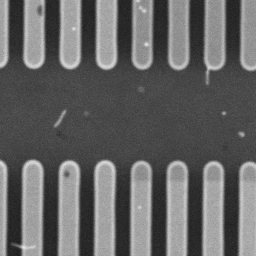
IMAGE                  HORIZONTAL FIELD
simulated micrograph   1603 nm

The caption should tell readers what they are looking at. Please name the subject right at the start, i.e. groups of lines, slits or small figures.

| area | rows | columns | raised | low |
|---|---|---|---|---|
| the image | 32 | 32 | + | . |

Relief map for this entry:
+..++...++..+++..++..+++..++..++
+..++...++..+++..++..+++..++..++
+..++...++..++...++..+++..++..++
+..++...++..++...++..+++..++..++
+..++...++..++...++..+++..++..++
+..++...++..++...++..+++..++..++
+..++...++..++...++..+++..++..++
+..++...++..++...++..+++..++..++
......................+...+....+
................................
................................
................................
................................
................................
................................
................................
................................
................................
................................
................................
...++...+...++...+....+...+....+
+..++...++..++...++..++...++..++
+..++...++..++..+++..++...++..++
+..++...++..++..+++..++...++..++
+..++..+++..++..+++..++..+++..++
+..++..+++..++..+++..++..+++..++
+..++..+++..++..+++..++..+++..++
+..++..+++..++..+++..++..+++..++
+..++..+++..++..+++..++..+++..++
+..++..+++..++..+++..++..+++..++
+..++..+++..++..+++..++..+++..++
+..++..+++..++..+++..++..+++..++